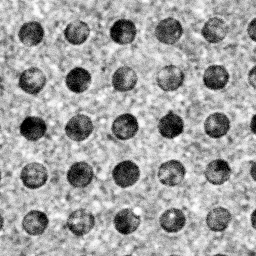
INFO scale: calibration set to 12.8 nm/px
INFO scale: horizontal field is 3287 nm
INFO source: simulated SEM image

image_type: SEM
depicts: a regular array of holes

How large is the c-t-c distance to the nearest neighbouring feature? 588 nanometres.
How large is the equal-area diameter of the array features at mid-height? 363 nanometres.